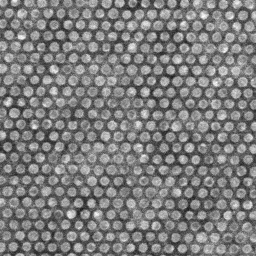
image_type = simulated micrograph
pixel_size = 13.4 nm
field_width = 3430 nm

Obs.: a regular array of raised bodies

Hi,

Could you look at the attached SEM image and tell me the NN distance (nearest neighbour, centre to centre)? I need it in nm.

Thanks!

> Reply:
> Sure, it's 167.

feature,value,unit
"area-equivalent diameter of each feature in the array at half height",112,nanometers